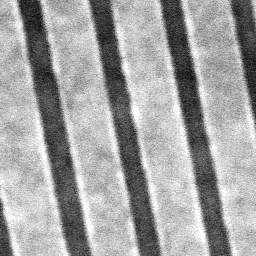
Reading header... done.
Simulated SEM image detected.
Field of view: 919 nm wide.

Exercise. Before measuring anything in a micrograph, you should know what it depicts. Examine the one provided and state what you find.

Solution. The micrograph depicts one or a few lines or trenches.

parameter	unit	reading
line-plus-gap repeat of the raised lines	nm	249